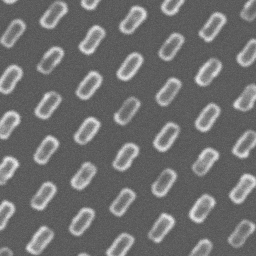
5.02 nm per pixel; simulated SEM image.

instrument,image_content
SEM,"a regular array of raised bodies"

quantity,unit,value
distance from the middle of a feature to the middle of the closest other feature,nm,226